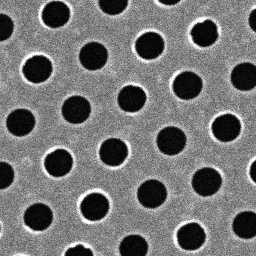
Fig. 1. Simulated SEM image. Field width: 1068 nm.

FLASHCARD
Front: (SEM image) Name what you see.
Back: a regular array of holes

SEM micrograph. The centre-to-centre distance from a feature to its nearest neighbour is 55.9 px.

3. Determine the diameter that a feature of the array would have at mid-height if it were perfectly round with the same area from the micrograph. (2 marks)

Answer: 28.4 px